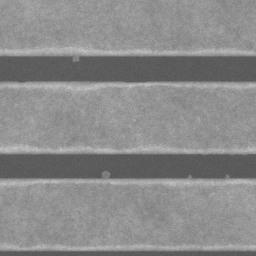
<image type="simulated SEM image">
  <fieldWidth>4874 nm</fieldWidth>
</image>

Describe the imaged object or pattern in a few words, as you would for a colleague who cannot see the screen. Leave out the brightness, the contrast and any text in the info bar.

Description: lines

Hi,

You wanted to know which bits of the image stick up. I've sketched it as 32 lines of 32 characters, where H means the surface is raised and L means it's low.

HHHHHHHHHHHHHHHHHHHHHHHHHHHHHHHH
HHHHHHHHHHHHHHHHHHHHHHHHHHHHHHHH
HHHHHHHHHHHHHHHHHHHHHHHHHHHHHHHH
HHHHHHHHHHHHHHHHHHHHHHHHHHHHHHHH
HHHHHHHHHHHHHHHHHHHHHHHHHHHHHHHH
HHHHHHHHHHHHHHHHHHHHHHHHHHHHHHHH
HHHHHHHHHHHHHHHHHHHHHHHHHHHHHHHH
LLLLLLLLLLLLLLLLLLLLLLLLLLLLLLLL
LLLLLLLLLLLLLLLLLLLLLLLLLLLLLLLL
LLLLLLLLLLLLLLLLLLLLLLLLLLLLLLLL
HHHHHHHHHHHHHHHHHHHHHHHHHHHHHHHH
HHHHHHHHHHHHHHHHHHHHHHHHHHHHHHHH
HHHHHHHHHHHHHHHHHHHHHHHHHHHHHHHH
HHHHHHHHHHHHHHHHHHHHHHHHHHHHHHHH
HHHHHHHHHHHHHHHHHHHHHHHHHHHHHHHH
HHHHHHHHHHHHHHHHHHHHHHHHHHHHHHHH
HHHHHHHHHHHHHHHHHHHHHHHHHHHHHHHH
HHHHHHHHHHHHHHHHHHHHHHHHHHHHHHHH
HHHHHHHHHHHHHHHHHHHHHHHHHHHHHHHH
LLLLLLLLLLLLLLLLLLLLLLLLLLLLLLLL
LLLLLLLLLLLLLLLLLLLLLLLLLLLLLLLL
LLLLLLLLLLLLLLLLLLLLLLLLLLLLLLLL
HHHHHHHHHHHHHHHHHHHHHHHHHHHHHHHH
HHHHHHHHHHHHHHHHHHHHHHHHHHHHHHHH
HHHHHHHHHHHHHHHHHHHHHHHHHHHHHHHH
HHHHHHHHHHHHHHHHHHHHHHHHHHHHHHHH
HHHHHHHHHHHHHHHHHHHHHHHHHHHHHHHH
HHHHHHHHHHHHHHHHHHHHHHHHHHHHHHHH
HHHHHHHHHHHHHHHHHHHHHHHHHHHHHHHH
HHHHHHHHHHHHHHHHHHHHHHHHHHHHHHHH
HHHHHHHHHHHHHHHHHHHHHHHHHHHHHHHH
LLLLLLLLLLLLLLLLLLLLLLLLLLLLLLLL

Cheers